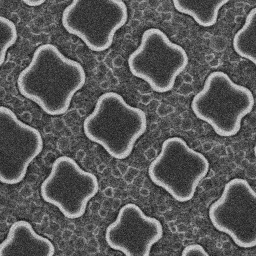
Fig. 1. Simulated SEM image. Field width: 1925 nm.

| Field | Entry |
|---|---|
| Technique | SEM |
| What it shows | raised bodies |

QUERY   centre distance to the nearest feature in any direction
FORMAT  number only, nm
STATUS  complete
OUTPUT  582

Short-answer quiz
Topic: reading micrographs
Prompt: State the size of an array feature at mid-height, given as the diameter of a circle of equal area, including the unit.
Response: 396 nm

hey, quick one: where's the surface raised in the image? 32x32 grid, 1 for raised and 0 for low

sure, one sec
00000000011111100000001111110000
00000000111111110000000111100000
10000000111111100000000001100001
11000000111111100000000000000011
11000000001111000011000000000011
10000000000111000011100000000111
10000110000000000111111000000011
00001111000000001111111000000001
00011111110000001111111000000000
00011111110000000111110000110000
00011111110000000001100000111000
00011111100000000000000001111110
00000111100001100000000011111110
00000011000011110000000011111110
11000000000111111100000001111100
11100000000111111100000000111100
11111000000111111100000000011000
11111000000011111000011000000000
11111000000001110000111100000000
11110000000000100000111110000000
11110001100000000001111111000000
11100001110000000001111111000000
11000011111100000001111110000000
00000111111100000000011100001110
00000011111000000000001100001111
00000001111000000000000000011111
00000000110000011100000000111111
00000000000000011110000000011111
00110000000000111111000000011111
01111000000001111111000000000111
11111100000000111110000000000011
11111100000000011100000111000000